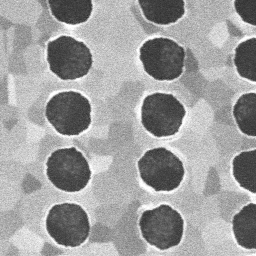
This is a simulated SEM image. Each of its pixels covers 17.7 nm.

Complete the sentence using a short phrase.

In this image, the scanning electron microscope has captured a regular array of holes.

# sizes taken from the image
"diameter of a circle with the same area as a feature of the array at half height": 0.804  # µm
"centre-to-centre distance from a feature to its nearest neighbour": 979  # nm